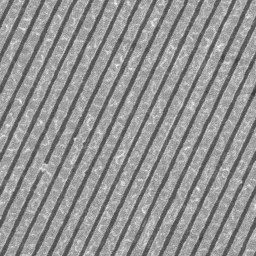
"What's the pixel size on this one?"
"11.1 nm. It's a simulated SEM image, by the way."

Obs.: parallel lines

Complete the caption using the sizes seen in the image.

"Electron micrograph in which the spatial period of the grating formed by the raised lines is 160 nm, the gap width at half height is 52.7 nm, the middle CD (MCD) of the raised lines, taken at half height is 104 nm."